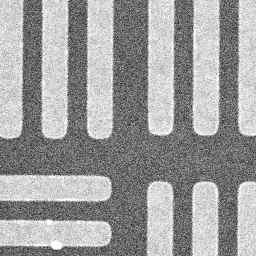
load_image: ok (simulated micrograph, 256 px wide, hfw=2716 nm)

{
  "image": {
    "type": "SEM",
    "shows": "groups of lines, slits or small figures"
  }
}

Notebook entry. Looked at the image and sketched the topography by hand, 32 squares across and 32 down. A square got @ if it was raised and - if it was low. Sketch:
@@@--@@@---@@@-----@@@--@@@---@@
@@@--@@@---@@@-----@@@--@@@---@@
@@@--@@@---@@@-----@@@--@@@---@@
@@@--@@@---@@@-----@@@--@@@---@@
@@@--@@@---@@@-----@@@--@@@---@@
@@@--@@@---@@@-----@@@--@@@---@@
@@@--@@@---@@@-----@@@--@@@---@@
@@@--@@@---@@@-----@@@--@@@---@@
@@@--@@@---@@@-----@@@--@@@---@@
@@@--@@@---@@@-----@@@--@@@---@@
@@@--@@@---@@@-----@@@--@@@---@@
@@@--@@@---@@@-----@@@--@@@---@@
@@@--@@@---@@@-----@@@--@@@---@@
@@@--@@@---@@@-----@@@--@@@---@@
@@@--@@@---@@@-----@@@--@@@---@@
@@@--@@@---@@@-----@@@--@@@---@@
@@@--@@@---@@@-----@@----@@---@@
--------------------------------
--------------------------------
--------------------------------
--------------------------------
--------------------------------
@@@@@@@@@@@@@@------------------
@@@@@@@@@@@@@@-----@@---@@@---@@
@@@@@@@@@@@@@@-----@@@--@@@---@@
-------------------@@@--@@@---@@
-------------------@@---@@@---@@
-------------------@@---@@@---@@
@@@@@@@@@@@@@@-----@@---@@@---@@
@@@@@@@@@@@@@@-----@@---@@@---@@
@@@@@@@@@@@@@------@@---@@@---@@
-------------------@@---@@@---@@